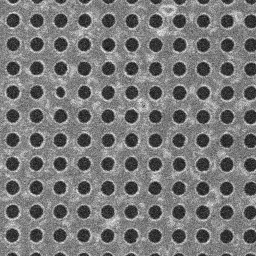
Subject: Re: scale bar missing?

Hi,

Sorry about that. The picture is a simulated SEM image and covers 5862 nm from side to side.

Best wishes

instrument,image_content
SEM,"a regular array of holes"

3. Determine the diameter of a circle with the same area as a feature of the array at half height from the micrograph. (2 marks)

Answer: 0.333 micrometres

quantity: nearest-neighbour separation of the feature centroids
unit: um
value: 0.54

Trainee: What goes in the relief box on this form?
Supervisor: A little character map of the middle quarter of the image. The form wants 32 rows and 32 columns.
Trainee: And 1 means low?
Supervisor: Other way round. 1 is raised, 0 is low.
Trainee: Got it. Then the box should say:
01100001110001100011100001100011
01100001100001100001100001100001
11110011110011110011100011100011
11111111111111111111111111111111
11111111111111111111111111111111
11110011110011110011110011110011
11100001100001100001100001100001
01100001100001100001100001100001
11110011110011110011110011100011
11111111111111111110011111111111
11111111111111111110011111111111
11110011110011110010110111110111
01100001100001100001100011100001
01100001100001100001100011100001
11110011110011110011110011110011
11111111111111111111111111111111
11111111111111111111111111111111
11110011110011110011110011110011
01100001100001100001100011100011
01100001100001100001100001100011
11110011110011110011110011110011
11111111111111111111111111111111
11111111111111111111111111111111
11110011110011110011110011110011
01100001100001100001100011100011
01100001100011100001100011100011
11110011110011110011110011110011
11111111111111111111111111111111
11111111111111111111111111111111
11110011110011110011110011110011
01100001100001100001100011100011
01100001100001100001100011100011